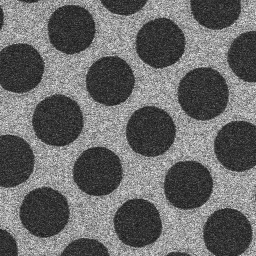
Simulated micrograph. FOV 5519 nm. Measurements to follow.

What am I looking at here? a regular array of holes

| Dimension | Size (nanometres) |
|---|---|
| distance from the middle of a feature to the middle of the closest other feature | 1390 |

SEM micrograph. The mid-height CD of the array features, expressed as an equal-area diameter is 1090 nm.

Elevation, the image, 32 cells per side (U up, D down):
UUUUUUUUUUUUUDDDDDUUUUUUDDDDDDUU
UUUUUUUDDDDUUUDDDUUUUUUUDDDDDDUU
DUUUUUDDDDDDUUUUUUUDDUUUDDDDDDUU
UUUUUUDDDDDDUUUUUUDDDDDUUUDDUUUU
UUUUUUDDDDDDUUUUUDDDDDDUUUUUUUDD
UUDDUUDDDDDUUUUUUDDDDDDUUUUUUDDD
DDDDDUUUDDUUUUUUUDDDDDDUUUUUDDDD
DDDDDUUUUUUUDDDUUUDDDDUUUUUUDDDD
DDDDDDUUUUUDDDDDUUUDDUUUUDUUUDDD
DDDDDUUUUUUDDDDDDUUUUUUDDDDDUUDD
DDDDDUUUUUUDDDDDDUUUUUDDDDDDUUUU
UDDUUUUUUUUDDDDDDUUUUUDDDDDDDUUU
UUUUUDDDDUUUDDDDUUUUUUDDDDDDDUUU
UUUUDDDDDDUUUUUUUDDDUUUDDDDDUUUU
UUUUDDDDDDUUUUUUDDDDDUUUDDDUUUUU
UUUUDDDDDDUUUUUUDDDDDDUUUUUUDDDD
UUUUDDDDDDUUUUUUDDDDDDUUUUUDDDDD
DDDUUDDDDUUUUUUUDDDDDDUUUUUDDDDD
DDDDUUUUUUUDDUUUDDDDDUUUUUUDDDDD
DDDDUUUUUUDDDDDUUUDDUUUUUUUDDDDD
DDDDUUUUUDDDDDDUUUUUUUDDDUUUDDDD
DDDDUUUUUDDDDDDUUUUUUDDDDDUUUUUU
DDDUUUUUUDDDDDDUUUUUUDDDDDDUUUUU
UUUUUDDUUUDDDDDUUUUUDDDDDDDUUUUU
UUUDDDDDUUUUDUUUUUUUUDDDDDUUUUUU
UUUDDDDDDUUUUUUDDDDUUDDDDDUUUUUU
UUDDDDDDDUUUUUUDDDDDUUUUUUUDDDUU
UUDDDDDDDUUUUUDDDDDDUUUUUUDDDDDU
UUUDDDDDUUUUUUDDDDDDUUUUUDDDDDDU
DDUUDDDUUUUUUUUDDDDDUUUUUDDDDDDD
DDUUUUUUUDDDDUUUDDDUUUUUUUDDDDDU
DDUUUUUUDDDDDDUUUUUUUUDUUUDDDDDU